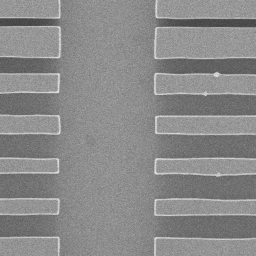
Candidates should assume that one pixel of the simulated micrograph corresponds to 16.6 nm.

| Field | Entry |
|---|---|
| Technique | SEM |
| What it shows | groups of lines, slits or small figures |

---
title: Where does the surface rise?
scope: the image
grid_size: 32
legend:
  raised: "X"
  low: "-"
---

XXXXXXX-------------XXXXXXXXXXXX
XXXXXXX-------------XXXXXXXXXXXX
--------------------------------
XXXXXXX-------------XXXXXXXXXXXX
XXXXXXX------------XXXXXXXXXXXXX
XXXXXXX------------XXXXXXXXXXXXX
XXXXXXX------------XXXXXXXXXXXXX
--------------------------------
--------------------------------
XXXXXXX------------XXXXXXXXXXXXX
XXXXXXX------------XXXXXXXXXXXXX
XXXXXXX------------XXXXXXXXXXXXX
--------------------------------
--------------------------------
XX-XXX--------------------------
XXXXXXX-------------XXXXXXXXXXXX
XXXXXXX-------------XXXXXXXXXXXX
--------------------------------
--------------------------------
--------------------------------
XXXXXXX------------XXXXXXXXXXXXX
XXXXXXX-------------XXXXXXXXXXXX
--------------------------------
--------------------------------
--------------------------------
XXXXXXX------------XXXXXXXXXXXXX
XXXXXXX------------XXXXXXXXXXXXX
--------------------------------
--------------------------------
--------------------------------
XXXXXXX------------XXXXXXXXXXXXX
XXXXXXX------------XXXXXXXXXXXXX